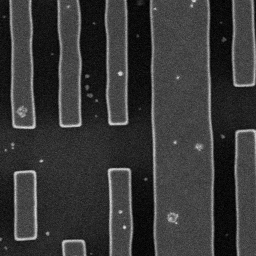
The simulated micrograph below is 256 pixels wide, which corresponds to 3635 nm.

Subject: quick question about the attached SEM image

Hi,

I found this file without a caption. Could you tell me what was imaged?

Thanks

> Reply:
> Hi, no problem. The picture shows groups of lines, slits or small figures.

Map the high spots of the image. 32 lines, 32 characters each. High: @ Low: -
-@@@---@@@---@@@---@@@@@@@---@@@
-@@@---@@@---@@@---@@@@@@@---@@@
-@@@---@@@---@@@---@@@@@@@---@@@
-@@@---@@@---@@@---@@@@@@@---@@@
-@@@---@@@---@@@---@@@@@@@---@@@
--@@---@@@---@@@---@@@@@@@---@@@
--@@----@@---@@@---@@@@@@@---@@@
--@@---@@@---@@@---@@@@@@@---@@@
--@@---@@@---@@@---@@@@@@@---@@@
--@@---@@@---@@@---@@@@@@@---@@@
--@@---@@@---@@@---@@@@@@@---@@@
-@@@---@@@---@@@---@@@@@@@------
-@@@---@@@---@@@---@@@@@@@------
--@@---@@@---@@@---@@@@@@@------
--@@---@@@----@@---@@@@@@@------
--@@----@@----@----@@@@@@@------
-------------------@@@@@@@----@@
-------------------@@@@@@@@--@@@
-------------------@@@@@@@@--@@@
-------------------@@@@@@@@--@@@
-------------------@@@@@@@@--@@@
--@@----------@@---@@@@@@@@--@@@
--@@----------@@---@@@@@@@@--@@@
--@@----------@@---@@@@@@@@--@@@
--@@----------@@---@@@@@@@@---@@
--@@----------@@---@@@@@@@@---@@
--@@----------@@---@@@@@@@@---@@
--@@----------@@@--@@@@@@@@---@@
--@@----------@@@--@@@@@@@@---@@
--@@----------@@@--@@@@@@@@---@@
--------@@@---@@---@@@@@@@@---@@
--------@@@---@@---@@@@@@@@---@@